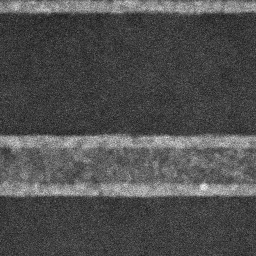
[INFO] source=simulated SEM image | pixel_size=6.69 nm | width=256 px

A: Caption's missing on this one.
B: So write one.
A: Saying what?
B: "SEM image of one or a few lines or trenches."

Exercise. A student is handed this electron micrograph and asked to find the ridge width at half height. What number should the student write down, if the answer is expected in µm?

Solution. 0.327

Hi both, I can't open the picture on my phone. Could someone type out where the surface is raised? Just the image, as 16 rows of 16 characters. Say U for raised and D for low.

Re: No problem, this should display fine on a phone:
DDDDDDDDDDDDDDDD
DDDDDDDDDDDDDDDD
DDDDDDDDDDDDDDDD
DDDDDDDDDDDDDDDD
DDDDDDDDDDDDDDDD
DDDDDDDDDDDDDDDD
DDDDDDDDDDDDDDDD
DDDDDDDDDDDDDDDD
DDDDDDDDDDDDDDDD
UUUUUUUUUUUUUUUU
UUUUUUUUUUUUUUUU
UUUUUUUUUUUUUUUU
DDDDDDDDDDDDDDDD
DDDDDDDDDDDDDDDD
DDDDDDDDDDDDDDDD
DDDDDDDDDDDDDDDD